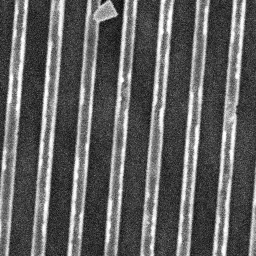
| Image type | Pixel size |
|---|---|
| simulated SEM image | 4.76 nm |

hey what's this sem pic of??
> parallel lines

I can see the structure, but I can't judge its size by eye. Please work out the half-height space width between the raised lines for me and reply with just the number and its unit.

0.117 um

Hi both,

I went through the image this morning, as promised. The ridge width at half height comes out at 56.9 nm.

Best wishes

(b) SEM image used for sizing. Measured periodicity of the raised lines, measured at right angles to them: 172 nm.